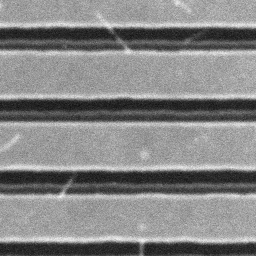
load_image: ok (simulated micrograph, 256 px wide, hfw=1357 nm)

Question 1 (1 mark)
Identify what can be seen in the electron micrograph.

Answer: lines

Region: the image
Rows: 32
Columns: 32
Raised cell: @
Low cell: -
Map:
@@@@@@@@@@@@@@@@@@@@@@@@@@@@@@@@
@@@@@@@@@@@@@@@@@@@@@@@@@@@@@@@@
@@@@@@@@@@@@@@@@@@@@@@@@@@@@@@@@
--------------------------------
--------------------------------
--------------------------------
@@@@@-@@@@@-@@@@@@@@@-@@@@@@@@@@
@@@@@@@@@@@@@@@@@@@@@@@@@@@@@@@@
@@@@@@@@@@@@@@@@@@@@@@@@@@@@@@@@
@@@@@@@@@@@@@@@@@@@@@@@@@@@@@@@@
@@@@@@@@@@@@@@@@@@@@@@@@@@@@@@@@
@@@@@@@@@@@@@@@@@@@@@@@@@@@@@@@@
--------------------------------
--------------------------------
--------------------------------
@@@@@@@@@@@@@@@@@@@@@@@@@@@@@@@@
@@@@@@@@@@@@@@@@@@@@@@@@@@@@@@@@
@@@@@@@@@@@@@@@@@@@@@@@@@@@@@@@@
@@@@@@@@@@@@@@@@@@@@@@@@@@@@@@@@
@@@@@@@@@@@@@@@@@@@@@@@@@@@@@@@@
@@@@@@@@@@@@@@@@@@@@@@@@@@@@@@@@
--------------------------------
--------------------------------
--------------------------------
@@@@@@@@@@@@@@@@@@@@@@@@@@@@@@@@
@@@@@@@@@@@@@@@@@@@@@@@@@@@@@@@@
@@@@@@@@@@@@@@@@@@@@@@@@@@@@@@@@
@@@@@@@@@@@@@@@@@@@@@@@@@@@@@@@@
@@@@@@@@@@@@@@@@@@@@@@@@@@@@@@@@
@@@@@@@@@@@@@@@@@@@@@@@@@@@@@@@@
--------------------------------
--------------------------------